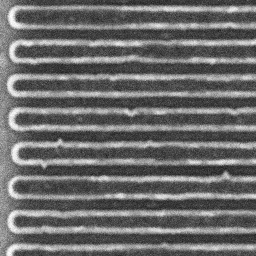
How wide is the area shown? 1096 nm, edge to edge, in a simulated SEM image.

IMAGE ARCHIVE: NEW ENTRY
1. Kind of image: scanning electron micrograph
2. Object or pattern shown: parallel lines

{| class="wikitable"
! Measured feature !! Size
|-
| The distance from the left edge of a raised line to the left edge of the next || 145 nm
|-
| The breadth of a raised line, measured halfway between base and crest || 85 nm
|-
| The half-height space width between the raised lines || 59.3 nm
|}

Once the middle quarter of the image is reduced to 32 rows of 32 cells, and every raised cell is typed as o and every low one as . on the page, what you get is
................................
................................
................................
oooooooooooooooooooooooooooooooo
oooooooooooooooooooooooooooooooo
oooooooooooooooooooooooooooooooo
oooooooooooooooooooooooooooooooo
ooooooooooooooooooooo.oooooooooo
................................
................................
................................
..................ooo.........oo
oooooooooooooooooooooooooooooooo
oooooooooooooooooooooooooooooooo
oooooooooooooooooooooooooooooooo
oooooooooooooooooooooooooooooooo
................................
................................
................................
................................
oooooooooooooooooooooooooooooooo
oooooooooooooooooooooooooooooooo
oooooooooooooooooooooooooooooooo
oooooooooooooooooooooooooooooooo
oooooooooooooooooooooooooooooooo
................................
................................
................................
.....oooooo.........ooo..ooooooo
oooooooooooooooooooooooooooooooo
oooooooooooooooooooooooooooooooo
oooooooooooooooooooooooooooooooo